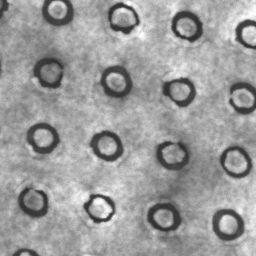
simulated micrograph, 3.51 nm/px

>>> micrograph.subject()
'a regular array of ring-shaped grooves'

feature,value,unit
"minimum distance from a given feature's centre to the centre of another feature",226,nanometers